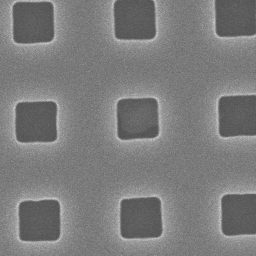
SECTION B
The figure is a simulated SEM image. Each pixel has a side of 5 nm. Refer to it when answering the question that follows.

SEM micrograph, holes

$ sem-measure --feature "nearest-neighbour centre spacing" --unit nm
496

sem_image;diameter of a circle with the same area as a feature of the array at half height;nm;233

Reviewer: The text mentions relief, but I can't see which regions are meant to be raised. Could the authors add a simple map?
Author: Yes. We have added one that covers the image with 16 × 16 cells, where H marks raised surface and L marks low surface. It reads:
HLLHHHHLLLHHHLLL
HLLHHHHLLLHHHLLL
HLLHHHHHHHHHHHHH
HHHHHHHHHHHHHHHH
HHHHHHHHHHHHHHHH
HHHHHHHHHHHHHHHH
HLLHHHHLLLHHHHLL
HLLLHHHLLLHHHHLL
HLLLHHHLLLHHHHLL
HHHHHHHHHHHHHHHH
HHHHHHHHHHHHHHHH
HHHHHHHHHHHHHHHH
HHHHHHHHLLHHHHLL
HLLLHHHLLLHHHHLL
HLLLHHHHLLHHHHLL
HHHHHHHHHHHHHHHH